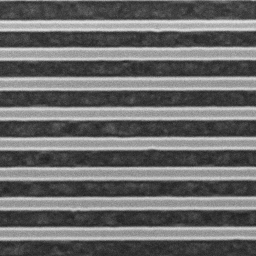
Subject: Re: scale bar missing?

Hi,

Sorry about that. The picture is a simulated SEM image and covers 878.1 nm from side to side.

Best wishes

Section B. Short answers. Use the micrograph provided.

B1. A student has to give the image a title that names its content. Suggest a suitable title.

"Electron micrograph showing parallel lines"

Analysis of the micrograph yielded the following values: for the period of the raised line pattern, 102 nm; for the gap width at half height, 18 px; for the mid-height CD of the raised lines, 39.9 nanometers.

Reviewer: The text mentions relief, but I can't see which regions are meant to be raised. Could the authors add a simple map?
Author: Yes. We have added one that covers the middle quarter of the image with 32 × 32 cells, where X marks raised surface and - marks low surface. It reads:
--------------------------------
--------------------------------
--------------------------------
------------XX------------------
XXXXXXXXXXXXXXXXXXXXXXXXXXXXXXXX
XXXXXXXXXXXXXXXXXXXXXXXXXXXXXXXX
--------------------------------
--------------------------------
--------------------------------
--------------------------------
--------------------------------
XXXXXXXXXXXXXXXXXXXXXXXXXXXXXXXX
XXXXXXXXXXXXXXXXXXXXXXXXXXXXXXXX
XXXXXXXXXXXXXXXXXXXXXXXXXXXXXXXX
--------------------------------
--------------------------------
--------------------------------
--------------------------------
XXXXXXX---XXX----XXX-XX-XXXXXX--
XXXXXXXXXXXXXXXXXXXXXXXXXXXXXXXX
XXXXXXXXXXXXXXXXXXXXXXXXXXXXXXXX
--------------------------------
--------------------------------
--------------------------------
--------------------------------
--------------------------------
XXXXXXXXXXXXXXXXXXXXXXXXXXXXXXXX
XXXXXXXXXXXXXXXXXXXXXXXXXXXXXXXX
XXXXXXXXXXXXXXXXXXXXXXXXXXXXXXXX
--------------------------------
--------------------------------
--------------------------------